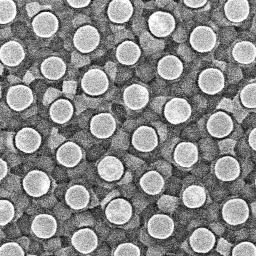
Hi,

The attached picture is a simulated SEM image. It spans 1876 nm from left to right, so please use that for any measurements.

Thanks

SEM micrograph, a regular array of raised bodies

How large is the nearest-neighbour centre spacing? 319 nanometers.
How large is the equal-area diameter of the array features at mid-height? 181 nanometres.